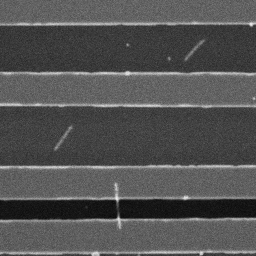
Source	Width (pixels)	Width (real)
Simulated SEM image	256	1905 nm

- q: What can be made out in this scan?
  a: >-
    lines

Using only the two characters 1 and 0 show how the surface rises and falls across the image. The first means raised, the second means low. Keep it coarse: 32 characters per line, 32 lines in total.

11111111111111111111111111111111
11111111111111111111111111111111
11111111111111111111111111111111
00000000000000000000000000000000
00000000000000000000000000000000
00000000000000000000000000000000
00000000000000000000000000000000
00000000000000000000000000000000
00000000000000000000000000000000
11111111111111111111111111111111
11111111111111111111111111111111
11111111111111111111111111111111
11111111111111111111111111111111
00000000000000000000000000000000
00000000000000000000000000000000
00000000000000000000000000000000
00000000000000000000000000000000
00000000000000000000000000000000
00000000000000000000000000000000
00000000000000000000000000000000
00000000000000000000000000000000
11111111111111111111111111111111
11111111111111111111111111111111
11111111111111111111111111111111
11111111111111111111111111111111
00000000000000000000000000000000
00000000000000000000000000000000
00000000001111111111111111111111
11111111111111111111111111111111
11111111111111111111111111111111
11111111111111111111111111111111
11111111111111111111110111000100